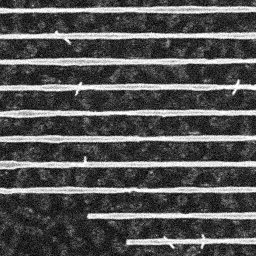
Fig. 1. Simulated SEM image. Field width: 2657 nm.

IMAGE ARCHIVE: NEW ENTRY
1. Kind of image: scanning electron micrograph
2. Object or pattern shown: parallel lines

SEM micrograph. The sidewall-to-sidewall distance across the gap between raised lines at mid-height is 232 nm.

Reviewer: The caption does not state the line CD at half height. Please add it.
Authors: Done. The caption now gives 0.0402 microns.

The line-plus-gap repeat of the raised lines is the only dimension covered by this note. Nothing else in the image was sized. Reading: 267 nm